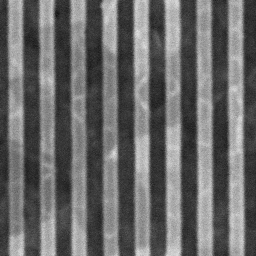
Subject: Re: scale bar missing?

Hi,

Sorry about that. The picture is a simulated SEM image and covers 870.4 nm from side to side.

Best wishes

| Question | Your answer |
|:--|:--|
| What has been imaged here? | parallel lines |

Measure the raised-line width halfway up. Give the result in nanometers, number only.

45.9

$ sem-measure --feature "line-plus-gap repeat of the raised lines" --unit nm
107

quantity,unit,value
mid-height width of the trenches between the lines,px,18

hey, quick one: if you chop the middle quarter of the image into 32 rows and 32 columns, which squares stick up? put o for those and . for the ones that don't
..ooo.....ooo.....ooo.....ooo...
..ooo.....ooo.....ooo.....ooo...
..ooo.....ooo.....ooo.....ooo...
..ooo.....ooo.....ooo.....ooo...
..ooo.....ooo.....ooo.....ooo...
..ooo.....ooo.....ooo.....ooo...
..ooo.....ooo.....ooo.....ooo...
..ooo.....ooo.....ooo.....ooo...
..ooo.....ooo.....ooo.....ooo...
..ooo.....ooo.....ooo.....ooo...
..ooo.....ooo.....ooo.....ooo...
..ooo.....ooo.....ooo.....ooo...
..ooo.....ooo.....ooo.....ooo...
..ooo.....ooo.....ooo.....ooo...
..ooo.....ooo.....ooo.....ooo...
..ooo.....ooo.....ooo.....ooo...
..ooo.....ooo.....ooo.....ooo...
..ooo.....ooo.....ooo.....ooo...
..ooo.....ooo.....ooo.....ooo...
..ooo.....ooo.....ooo.....ooo...
..ooo.....ooo.....ooo.....ooo...
..ooo.....ooo.....ooo.....ooo...
..ooo.....ooo.....ooo.....ooo...
..ooo.....ooo.....ooo.....ooo...
..ooo.....ooo.....ooo.....ooo...
..ooo.....ooo.....ooo.....ooo...
..ooo.....ooo.....ooo.....ooo...
..ooo.....ooo.....ooo.....ooo...
..ooo.....ooo.....ooo.....ooo...
..ooo.....ooo.....ooo.....ooo...
..ooo.....ooo.....ooo.....ooo...
..ooo.....ooo.....ooo.....ooo...